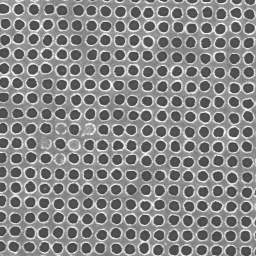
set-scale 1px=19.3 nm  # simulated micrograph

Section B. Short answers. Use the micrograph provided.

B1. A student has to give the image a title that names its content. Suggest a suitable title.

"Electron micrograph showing a regular array of holes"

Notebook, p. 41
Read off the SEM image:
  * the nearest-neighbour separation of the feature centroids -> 266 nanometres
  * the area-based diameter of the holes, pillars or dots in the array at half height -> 206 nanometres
